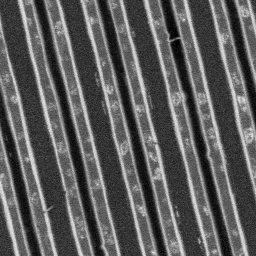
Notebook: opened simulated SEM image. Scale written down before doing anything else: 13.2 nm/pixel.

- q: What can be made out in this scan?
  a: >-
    parallel lines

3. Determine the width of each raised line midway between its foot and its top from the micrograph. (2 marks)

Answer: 171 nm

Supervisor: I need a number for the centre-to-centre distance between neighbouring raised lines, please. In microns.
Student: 0.408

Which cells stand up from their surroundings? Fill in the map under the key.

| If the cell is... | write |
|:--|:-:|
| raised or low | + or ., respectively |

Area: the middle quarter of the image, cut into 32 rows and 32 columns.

++.......+++...+++.......+++...+
+++......+++...++++......+++...+
+++......++++...+++......+++....
+++.......+++...+++......+++....
+++.......+++...+++......++++...
++++......+++...++++......+++...
.+++......+++....+++......+++...
.+++......+++....+++......++++..
.+++.......+++...+++......++++..
.++++......+++...++++......+++..
..+++......+++...++++......+++..
..+++......++++...+++......++++.
..+++......++++...+++......++++.
..++++......+++...+++.......+++.
...+++......+++...++++......+++.
...+++......++++...+++......+++.
...+++......++++...+++......++++
...++++......+++...+++.......+++
....+++......+++...++++......+++
+...+++......++++...+++......+++
+...+++......++++...+++......+++
+...++++......+++...+++.......++
+...++++......+++...++++......++
++...+++......+++....+++......++
++...+++......++++...+++......++
++...+++.......+++...+++......++
++...++++......+++...++++......+
+++...+++......+++...++++......+
+++...+++......+++....+++......+
+++...+++.......+++...+++......+
+++...++++......+++...++++......
++++...+++......+++....+++......